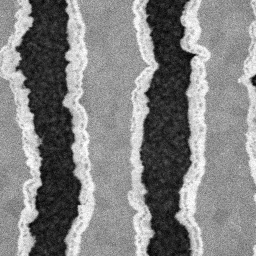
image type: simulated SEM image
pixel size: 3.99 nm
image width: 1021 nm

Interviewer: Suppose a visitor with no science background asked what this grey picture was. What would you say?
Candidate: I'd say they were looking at one or a few lines or trenches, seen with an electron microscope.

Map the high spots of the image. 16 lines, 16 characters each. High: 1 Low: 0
1100111110001111
1100011110011111
1000011110001111
1000011110001111
1000011110001111
1000011110001111
1000011110001111
1100011110001111
1100011110001111
1100011100001111
1100011100001111
1100011110001111
1100011110011111
1100011110011111
1100011110001111
1100111110001111